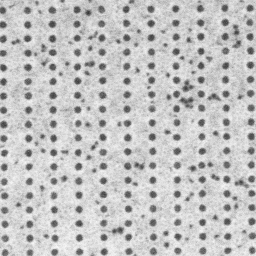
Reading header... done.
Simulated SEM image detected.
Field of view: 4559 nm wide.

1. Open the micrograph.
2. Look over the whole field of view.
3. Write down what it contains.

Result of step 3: a regular array of holes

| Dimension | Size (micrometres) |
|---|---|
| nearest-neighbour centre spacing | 0.227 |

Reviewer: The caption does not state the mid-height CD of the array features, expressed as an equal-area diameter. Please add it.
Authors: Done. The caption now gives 144 nanometres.